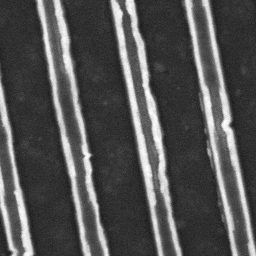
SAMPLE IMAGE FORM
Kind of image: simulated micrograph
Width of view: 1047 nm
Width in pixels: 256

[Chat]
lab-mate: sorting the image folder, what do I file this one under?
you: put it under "one or a few lines or trenches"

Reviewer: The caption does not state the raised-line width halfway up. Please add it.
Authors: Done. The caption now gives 79.4 nm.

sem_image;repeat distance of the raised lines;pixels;72.8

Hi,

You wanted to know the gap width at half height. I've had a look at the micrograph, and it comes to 220 nm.